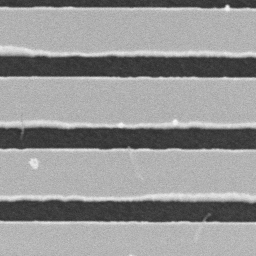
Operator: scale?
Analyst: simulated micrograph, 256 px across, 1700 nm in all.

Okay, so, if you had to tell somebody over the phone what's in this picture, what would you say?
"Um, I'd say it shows lines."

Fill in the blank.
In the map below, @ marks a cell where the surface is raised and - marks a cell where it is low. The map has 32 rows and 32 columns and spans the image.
--------------------------------
@@@@@@@@@@@@@@@@@@@@@@@@@@@@@@@@
@@@@@@@@@@@@@@@@@@@@@@@@@@@@@@@@
@@@@@@@@@@@@@@@@@@@@@@@@@@@@@@@@
@@@@@@@@@@@@@@@@@@@@@@@@@@@@@@@@
@@@@@@@@@@@@@@@@@@@@@@@@@@@@@@@@
@@@@@@@@@@@@@@@@@@@@@@@@@@@@@@@@
--------------------------------
--------------------------------
--------------------------------
@@@@@@@@@@@@@@@@@@@@@@@@@@@@@@@@
@@@@@@@@@@@@@@@@@@@@@@@@@@@@@@@@
@@@@@@@@@@@@@@@@@@@@@@@@@@@@@@@@
@@@@@@@@@@@@@@@@@@@@@@@@@@@@@@@@
@@@@@@@@@@@@@@@@@@@@@@@@@@@@@@@@
@@@@@@@@@@@@@@@@@@@@@@@@@@@@@@@@
--------------------------------
--------------------------------
--------------------------------
@@@@@@@@@@@@@@@@@@@@@@@@@@@@@@@@
@@@@@@@@@@@@@@@@@@@@@@@@@@@@@@@@
@@@@@@@@@@@@@@@@@@@@@@@@@@@@@@@@
@@@@@@@@@@@@@@@@@@@@@@@@@@@@@@@@
@@@@@@@@@@@@@@@@@@@@@@@@@@@@@@@@
@@@@@@@@@@@@@@@@@@@@@@@@@@@@@@@@
--------------------------------
--------------------------------
--------------------------------
@@@@@@@@@@@@@@@@@@@@@@@@@@@@@@@@
@@@@@@@@@@@@@@@@@@@@@@@@@@@@@@@@
@@@@@@@@@@@@@@@@@@@@@@@@@@@@@@@@
@@@@@@@@@@@@@@@@@@@@@@@@@@@@@@@@